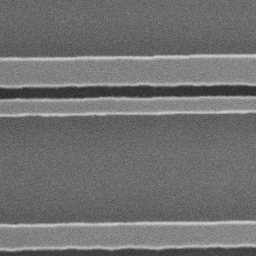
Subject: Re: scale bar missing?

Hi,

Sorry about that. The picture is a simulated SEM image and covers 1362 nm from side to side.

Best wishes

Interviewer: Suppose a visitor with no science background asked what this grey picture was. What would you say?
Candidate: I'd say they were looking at lines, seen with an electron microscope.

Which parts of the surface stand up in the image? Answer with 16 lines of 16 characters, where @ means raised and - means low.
----------------
----------------
----------------
----------------
@@@@@@@@@@@@@@@@
@@@@@@@@@@@@@@@@
@@@@@@@@@@@@@@@@
----------------
----------------
----------------
----------------
----------------
----------------
----------------
@@@@@@@@@@@@@@@@
@@@@@@@@@@@@@@@@